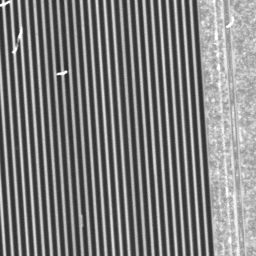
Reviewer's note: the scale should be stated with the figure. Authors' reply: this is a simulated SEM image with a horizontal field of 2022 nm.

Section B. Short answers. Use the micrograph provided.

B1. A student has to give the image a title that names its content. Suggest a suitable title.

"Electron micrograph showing parallel lines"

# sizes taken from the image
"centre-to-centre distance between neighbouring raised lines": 61.5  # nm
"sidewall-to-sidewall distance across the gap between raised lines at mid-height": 0.0384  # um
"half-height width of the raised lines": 22.7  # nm